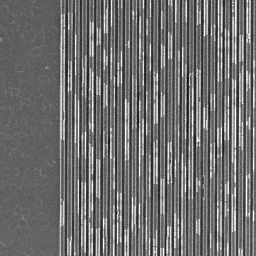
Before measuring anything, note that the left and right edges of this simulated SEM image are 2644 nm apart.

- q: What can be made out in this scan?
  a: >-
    parallel lines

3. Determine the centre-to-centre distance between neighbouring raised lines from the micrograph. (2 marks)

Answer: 73.7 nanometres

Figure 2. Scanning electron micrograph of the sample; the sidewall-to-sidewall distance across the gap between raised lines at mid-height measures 27.1 nanometers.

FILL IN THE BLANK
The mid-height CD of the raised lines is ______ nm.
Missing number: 45.2